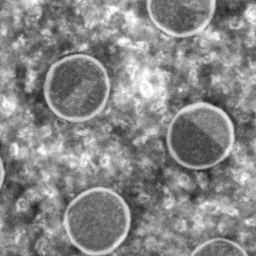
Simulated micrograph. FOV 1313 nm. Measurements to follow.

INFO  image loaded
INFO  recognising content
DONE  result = raised bodies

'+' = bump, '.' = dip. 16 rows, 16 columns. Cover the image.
.........++++...
..........+++...
................
................
...++++.........
...++++.........
...+++..........
...........+++..
...........+++..
...........+++..
................
................
.....+++........
....++++........
....++++........
.....++.....+++.